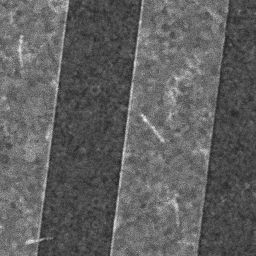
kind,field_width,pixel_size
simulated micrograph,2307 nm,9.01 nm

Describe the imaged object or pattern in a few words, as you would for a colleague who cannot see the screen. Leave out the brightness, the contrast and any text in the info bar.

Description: one or a few lines or trenches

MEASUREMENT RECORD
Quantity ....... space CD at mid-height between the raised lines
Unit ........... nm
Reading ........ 666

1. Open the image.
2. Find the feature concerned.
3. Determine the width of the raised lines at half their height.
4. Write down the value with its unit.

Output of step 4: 0.769 um